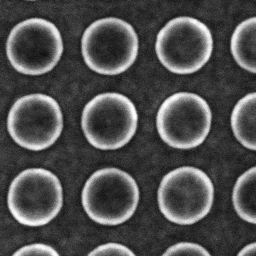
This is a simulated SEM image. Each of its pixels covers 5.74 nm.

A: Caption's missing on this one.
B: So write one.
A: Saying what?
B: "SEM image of a regular array of raised bodies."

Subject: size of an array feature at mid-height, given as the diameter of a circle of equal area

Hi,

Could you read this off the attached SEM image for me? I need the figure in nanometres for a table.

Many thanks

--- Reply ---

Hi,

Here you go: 309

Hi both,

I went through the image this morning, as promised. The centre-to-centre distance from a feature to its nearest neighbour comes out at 430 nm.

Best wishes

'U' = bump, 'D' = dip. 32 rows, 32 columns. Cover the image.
DDDDDDDDDDDDDDDDDDDDDDDDDDDDDDDD
DDDDDDDDDDDDDDDDDDDDDDDDDDDDDDDD
DDDDUDDDDDDDDUUDDDDDDDUUDDDDDDDU
DDUUUUUDDDDUUUUUDDDDDUUUUUDDDDUU
DUUUUUUDDDDUUUUUUDDDUUUUUUDDDUUU
DUUUUUUUDDUUUUUUUDDDUUUUUUDDDUUU
DUUUUUUUDDUUUUUUUDDDUUUUUUDDDUUU
DUUUUUUDDDDUUUUUUDDDUUUUUUDDDDUU
DDUUUUDDDDDDUUUUDDDDDUUUUDDDDDDU
DDDDDDDDDDDDDDDDDDDDDDDDDDDDDDDD
DDDDDDDDDDDDDDDDDDDDDDDDDDDDDDDD
DDDDDDDDDDDDDDDDDDDDDDDDDDDDDDDD
DDDUUUDDDDDDUUUUDDDDDUUUUDDDDDUU
DDUUUUUDDDDUUUUUUDDDUUUUUUDDDDUU
DUUUUUUDDDUUUUUUUDDDUUUUUUDDDUUU
DUUUUUUUDDUUUUUUUDDDUUUUUUDDDUUU
DUUUUUUDDDDUUUUUUDDDUUUUUUDDDUUU
DDUUUUUDDDDUUUUUDDDDDUUUUDDDDDUU
DDDDUDDDDDDDDUDDDDDDDDDDDDDDDDDU
DDDDDDDDDDDDDDDDDDDDDDDDDDDDDDDD
DDDDDDDDDDDDDDDDDDDDDDDDDDDDDDDD
DDDUUUDDDDDDUUUDDDDDDDUUUDDDDDDU
DDUUUUUDDDDUUUUUDDDDDUUUUUDDDDUU
DUUUUUUDDDDUUUUUUDDDUUUUUUDDDUUU
DUUUUUUUDDUUUUUUUDDDUUUUUUDDDUUU
DUUUUUUUDDUUUUUUUDDDUUUUUUDDDUUU
DDUUUUUDDDDUUUUUDDDDDUUUUUDDDDUU
DDDUUUDDDDDDUUUDDDDDDDUUDDDDDDDU
DDDDDDDDDDDDDDDDDDDDDDDDDDDDDDDD
DDDDDDDDDDDDDDDDDDDDDDDDDDDDDDDD
DDDDDDDDDDDDDDDDDDDDDDDDDDDDDDDD
DDUUUUUDDDDDUUUUDDDDDUUUUUDDDDUU